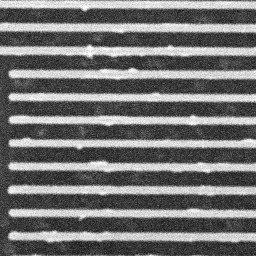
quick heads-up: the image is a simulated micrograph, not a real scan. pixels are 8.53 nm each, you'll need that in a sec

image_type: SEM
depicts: parallel lines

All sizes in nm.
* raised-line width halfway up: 57.6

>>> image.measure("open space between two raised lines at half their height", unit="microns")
0.138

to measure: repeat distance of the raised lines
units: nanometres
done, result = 198